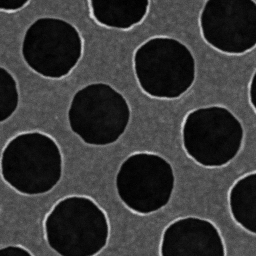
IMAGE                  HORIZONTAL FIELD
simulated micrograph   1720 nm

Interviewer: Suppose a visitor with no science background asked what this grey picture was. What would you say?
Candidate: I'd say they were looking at holes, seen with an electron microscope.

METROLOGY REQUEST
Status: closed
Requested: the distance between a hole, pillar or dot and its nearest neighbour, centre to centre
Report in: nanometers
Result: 549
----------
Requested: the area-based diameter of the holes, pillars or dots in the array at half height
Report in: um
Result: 0.403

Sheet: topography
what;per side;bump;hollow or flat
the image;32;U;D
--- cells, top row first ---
DDDUUUUUUUUUDDDDDDUUUUUUUUDDDDDD
UUUUUUUUUUUUDDDDDDUUUUUUUDDDDDDD
UUUUUDDDUUUUDDDDDDUUUUUUUDDDDDDD
UUUUDDDDDUUUUUUDUUUUUUUUUDDDDDDD
UUUDDDDDDDUUUUUUUUUUUUUUUUDDDDDD
UUUDDDDDDDUUUUUUUUDDDDDUUUDDDDDD
UUUDDDDDDDUUUUUUUDDDDDDDUUUUDDUU
UUUDDDDDDDUUUUUUUDDDDDDDUUUUUUUU
UUUUDDDDDUUUUUUUUDDDDDDDUUUUUUUU
DUUUUUDDUUUUUUUUUDDDDDDDUUUUUUUU
DDUUUUUUUUUUDUUUUUDDDDDDUUUUUUUD
DDUUUUUUUUDDDDDUUUDDDDDUUUUUUUUD
DDUUUUUUUDDDDDDDUUUUUUUUUUUUUUUD
DDUUUUUUUDDDDDDDUUUUUUUUUUDDUUUU
DUUUUUUUUDDDDDDDUUUUUUUUDDDDDUUU
UUUUUUUUUDDDDDDDUUUUUUUDDDDDDDUU
UUUUUUUUUDDDDDDUUUUUUUUDDDDDDDUU
UUDDDDUUUUDDDDDUUUUUUUUDDDDDDDUU
UDDDDDDUUUUUUUUUUUUUUUUDDDDDDDUU
DDDDDDDDUUUUUUUUDDDDUUUUDDDDDUUU
DDDDDDDDUUUUUUUDDDDDDUUUUDDDUUUU
DDDDDDDDUUUUUUUDDDDDDDUUUUUUUUUU
UDDDDDDUUUUUUUUDDDDDDDUUUUUUUUDD
UUDDDDUUUUUUUUUDDDDDDDUUUUUUUDDD
UUUUUUUUUUUUUUUDDDDDDUUUUUUUUDDD
UUUUUUUDDDDDUUUUDDDDDUUUUUUUUDDD
UUUUUUDDDDDDDUUUUUDUUUUUUUUUUDDD
UUUUUUDDDDDDDUUUUUUUUUUDDUUUUUDD
UUUUUUDDDDDDDDUUUUUUUDDDDDDUUUUD
UUUUUUDDDDDDDUUUUUUUDDDDDDDUUUUU
UUUUUUDDDDDDDUUUUUUUDDDDDDDDUUUU
DDDUUUUDDDDDUUUUUUUUDDDDDDDDUUUU